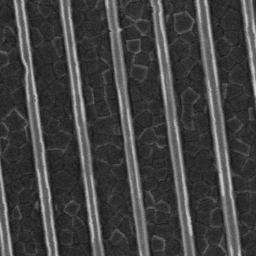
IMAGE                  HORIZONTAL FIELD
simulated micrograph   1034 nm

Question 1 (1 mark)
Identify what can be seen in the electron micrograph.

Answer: parallel lines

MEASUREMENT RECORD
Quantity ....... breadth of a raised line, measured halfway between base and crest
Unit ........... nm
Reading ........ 40.9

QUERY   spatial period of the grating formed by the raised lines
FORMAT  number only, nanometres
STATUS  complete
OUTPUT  182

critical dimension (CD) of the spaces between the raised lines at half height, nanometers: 140